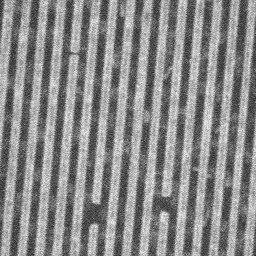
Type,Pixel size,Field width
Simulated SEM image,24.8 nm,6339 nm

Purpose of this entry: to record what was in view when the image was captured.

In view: parallel lines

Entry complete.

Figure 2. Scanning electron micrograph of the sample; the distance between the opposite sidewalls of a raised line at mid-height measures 0.182 micrometres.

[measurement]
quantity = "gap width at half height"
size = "250 nanometres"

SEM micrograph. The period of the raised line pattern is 429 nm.